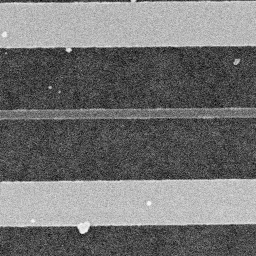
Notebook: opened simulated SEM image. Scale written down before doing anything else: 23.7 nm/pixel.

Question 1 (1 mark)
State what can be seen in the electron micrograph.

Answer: lines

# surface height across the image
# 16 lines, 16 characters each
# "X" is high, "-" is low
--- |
XXXXXXXXXXXXXXXX
XXXXXXXXXXXXXXXX
XXXXXXXXXXXXXXXX
----------------
----------------
----------------
----------------
----------------
----------------
----------------
----------------
XXXXXXXXXXXXXXXX
XXXXXXXXXXXXXXXX
XXXXXXXXXXXXXXXX
----------------
----------------